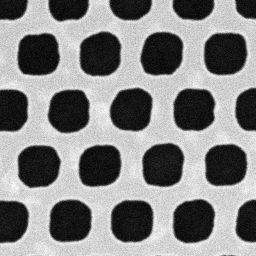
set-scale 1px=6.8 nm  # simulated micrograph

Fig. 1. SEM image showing a regular array of holes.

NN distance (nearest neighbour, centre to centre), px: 61.8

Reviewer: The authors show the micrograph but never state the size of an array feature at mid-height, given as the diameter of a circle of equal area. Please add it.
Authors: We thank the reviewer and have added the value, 0.304 micrometres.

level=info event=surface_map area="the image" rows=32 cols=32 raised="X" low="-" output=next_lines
---XXX-----XXX-----XXX-----XX---
---XXX-----XXX-----XXX-----XXX--
--XXXXX--XXXXXXX-XXXXXX--XXXXXXX
XXXXXXXXXXXXXXXXXXXXXXXXXXXXXXXX
XXX----XXXX---XXXXX---XXXX----XX
XX-----XXX-----XXX-----XXX-----X
XX-----XXX-----XXX-----XXX-----X
XX-----XXX-----XXX-----XXX-----X
XX-----XXX-----XXX----XXXX----XX
XXXX-XXXXXXX-XXXXXXXXXXXXXXXXXXX
XXXXXXXXXXXXXXXXXXXXXXXXXXXXXXXX
---XXXX---XXXXX---XXXX----XXXX--
---XXX-----XXX-----XXX-----XXX--
----XX-----XXX-----XXX-----XX---
----XX-----XXX-----XXX-----XX---
---XXX-----XXX-----XXX----XXXX--
X-XXXXX--XXXXXXXXXXXXXXXXXXXXXXX
XXXXXXXXXXXXXXXXXXXXXXXXXXXXXXXX
XXX----XXXX----XXXX---XXXX----XX
XX-----XXX-----XXX-----XXX-----X
XX------XX-----XXX-----XXX-----X
XX-----XXX-----XXX-----XXX-----X
XXX----XXX-----XXX----XXXX----XX
XXXXXXXXXXXXXXXXXXXXXXXXXXXXXXXX
XXXXXXXXXXXXXXXXXXXXXXXXXXXXXXXX
---XXXX----XXXX----XXXX---XXXX--
----XX-----XXX-----XXX-----XXX--
----XX-----XXX-----XXX-----XXX--
---XXX-----XXX-----XXX-----XX---
---XXX-----XXX-----XXX----XXXX--
XXXXXXXXXXXXXXXXXXXXXXXXXXXXXXXX
XXXXXXXXXXXXXXXXXXXXXXXXXXXXXXXX